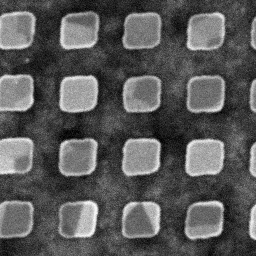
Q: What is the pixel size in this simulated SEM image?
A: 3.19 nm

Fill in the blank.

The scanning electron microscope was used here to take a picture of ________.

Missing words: a regular array of raised bodies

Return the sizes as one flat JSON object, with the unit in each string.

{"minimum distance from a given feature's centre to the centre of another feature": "62.4 px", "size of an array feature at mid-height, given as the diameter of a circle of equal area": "124 nanometres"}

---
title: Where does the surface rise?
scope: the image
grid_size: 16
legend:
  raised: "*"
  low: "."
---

................
**..**..**..**..
**..**..**..**..
................
................
**..**..**..**..
**..**..**..**..
................
................
**..**..**..**..
**..**..**..**..
................
................
**..**..**..**..
**..**..**..**..
................